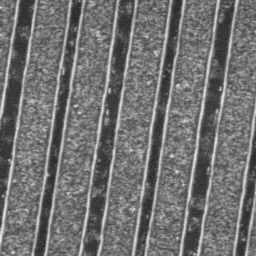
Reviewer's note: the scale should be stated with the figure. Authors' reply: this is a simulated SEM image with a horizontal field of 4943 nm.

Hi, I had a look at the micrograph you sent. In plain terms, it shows parallel lines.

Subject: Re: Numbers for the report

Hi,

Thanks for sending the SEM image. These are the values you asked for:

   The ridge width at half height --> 666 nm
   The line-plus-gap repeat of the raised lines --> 952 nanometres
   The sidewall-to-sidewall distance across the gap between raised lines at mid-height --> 16.8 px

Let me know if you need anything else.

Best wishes